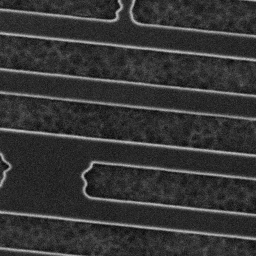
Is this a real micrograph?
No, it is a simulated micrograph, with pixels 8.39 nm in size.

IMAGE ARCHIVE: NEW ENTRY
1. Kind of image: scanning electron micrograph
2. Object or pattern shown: parallel lines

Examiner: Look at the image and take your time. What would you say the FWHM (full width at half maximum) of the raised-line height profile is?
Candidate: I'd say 207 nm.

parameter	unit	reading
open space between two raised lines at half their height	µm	0.295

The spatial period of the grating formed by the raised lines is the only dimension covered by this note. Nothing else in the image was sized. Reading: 496 nm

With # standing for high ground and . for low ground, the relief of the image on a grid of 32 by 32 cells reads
...............##...............
###............#................
#############.###...............
######################..........
...#############################
............####################
......................##########
...............................#
................................
#########.......................
##################..............
############################....
........########################
..................##############
...........................#####
................................
####............................
##############..................
#######################.........
################################
.###########..##################
.##########............#########
###########.....................
###########.....................
###########.....................
###################.............
#############################...
.........#######################
...................#############
............................####
................................
#####...........................